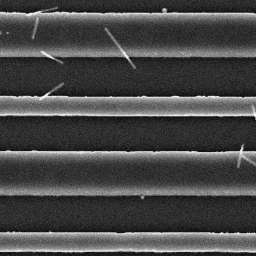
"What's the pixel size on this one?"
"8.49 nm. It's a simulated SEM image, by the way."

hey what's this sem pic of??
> lines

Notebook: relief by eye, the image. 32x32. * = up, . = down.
................................
................................
********************************
********************************
********************************
********************************
********************************
................................
................................
................................
................................
................................
********************************
********************************
................................
................................
................................
................................
................................
********************************
********************************
********************************
********************************
********************************
................................
................................
................................
................................
................................
********************************
********************************
...............................*